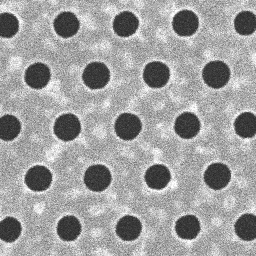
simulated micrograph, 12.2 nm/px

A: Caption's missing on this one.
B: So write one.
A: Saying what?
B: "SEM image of a regular array of holes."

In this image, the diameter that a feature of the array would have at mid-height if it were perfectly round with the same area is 342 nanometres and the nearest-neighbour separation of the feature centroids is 0.719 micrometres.